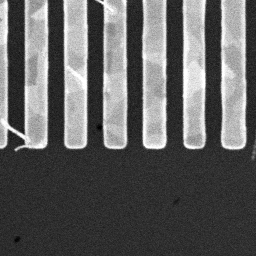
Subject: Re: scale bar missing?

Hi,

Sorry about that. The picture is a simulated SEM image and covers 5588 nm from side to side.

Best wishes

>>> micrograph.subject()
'wiring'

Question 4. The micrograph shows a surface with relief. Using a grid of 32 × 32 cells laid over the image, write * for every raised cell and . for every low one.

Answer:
*..***..***..***..***..***..***.
*..***..***..***..***..***..***.
*..***..***..***..***..***..***.
*..***..***..***..***..***..***.
*..***..***..***..***..***..***.
*..***..***..***..***..***..***.
*..***..***..***..***..***..***.
*..***..***..***..***..***..***.
*..***..***..***..***..***..***.
*..***..***..***..***..***..***.
*..***..***..***..***..***..***.
*..***..***..***..***..***..***.
*..***..***..***..***..***..***.
*..***..***..***..***..***..***.
*..***..***..***..***..***..***.
*..***..***..***..***..***..***.
*..***..***..***..***..***..***.
*..***..***..***..***..***..***.
............................**..
................................
................................
................................
................................
................................
................................
................................
................................
................................
................................
................................
................................
................................